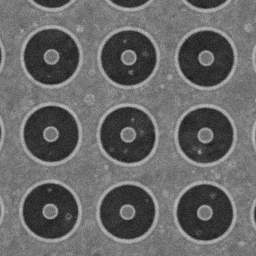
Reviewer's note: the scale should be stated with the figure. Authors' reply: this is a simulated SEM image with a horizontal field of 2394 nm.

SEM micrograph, an array of small figures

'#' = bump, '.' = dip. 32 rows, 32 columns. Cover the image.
####.....#####....#####.....####
################################
################################
######.#########################
####.....#####.....####.....####
###.......###......####......###
###...#...###.......##.......###
###...#...##...##...##...#...###
###.......###.......##.......###
####.....####......####......###
#####...######....######....####
################################
################################
#####...######...#######...#####
####.....####......####.....####
###.......###......###.......###
###...#...##...##...##...#...###
###...#...##........##...#...###
###.......###......###.......###
####.....#####.....####.....####
###############..#######...#####
################################
################################
####.....#####....#####.....####
###......####......####......###
###.......##........##.......###
###...#...##...##...##...#...###
###.......##.......###.......###
###......####......###.......###
####....######....#####.....####
################################
################################